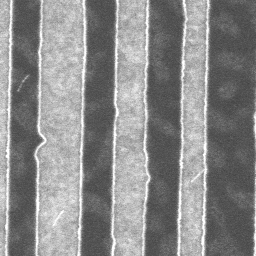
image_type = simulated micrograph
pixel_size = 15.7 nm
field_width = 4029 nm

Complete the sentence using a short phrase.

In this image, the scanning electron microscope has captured one or a few lines or trenches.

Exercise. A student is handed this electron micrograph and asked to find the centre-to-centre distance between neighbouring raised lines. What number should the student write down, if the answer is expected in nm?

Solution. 1100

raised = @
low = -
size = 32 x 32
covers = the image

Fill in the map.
-@@@@-----@@@@@---@@@@@---@@@@@@
-@@@@------@@@@---@@@@@---@@@@@@
-@@@@------@@@@---@@@@@---@@@@@@
-@@@@------@@@@---@@@@@---@@@@@@
-@@@@-----@@@@@---@@@@@---@@@@@@
-@@@@-----@@@@@---@@@@@---@@@@@@
-@@@@------@@@@---@@@@@---@@@@@@
-@@@@-----@@@@@---@@@@@---@@@@@@
-@@@@-----@@@@@---@@@@@---@@@@@@
-@@@@-----@@@@@---@@@@@---@@@@@@
-@@@@-----@@@@@---@@@@@---@@@@@@
-@@@@-----@@@@@---@@@@@---@@@@@@
-@@@@-----@@@@@---@@@@@---@@@@@@
-@@@@-----@@@@@---@@@@@---@@@@@@
-@@@@-----@@@@@---@@@@@---@@@@@@
-@@@@-----@@@@----@@@@@---@@@@@@
-@@@@-----@@@@----@@@@@---@@@@@@
-@@@@@----@@@@----@@@@@---@@@@@@
-@@@@-----@@@@----@@@@@---@@@@@@
-@@@@-----@@@@----@@@@@--@@@@@@@
-@@@@-----@@@@----@@@@@---@@@@@@
-@@@@-----@@@@----@@@@@---@@@@@@
-@@@@-----@@@@-----@@@@---@@@@@@
-@@@@-----@@@@----@@@@@---@@@@@@
-@@@@-----@@@@----@@@@@--@@@@@@@
-@@@@-----@@@@----@@@@@--@@@@@@@
-@@@@-----@@@@----@@@@@--@@@@@@@
-@@@@-----@@@@----@@@@@--@@@@@@@
-@@@@-----@@@@----@@@@---@@@@@@@
-@@@@-----@@@@----@@@@---@@@@@@@
-@@@@-----@@@@----@@@@---@@@@@@@
-@@@@-----@@@@----@@@@---@@@@@@@